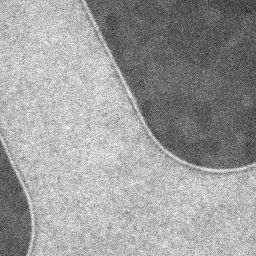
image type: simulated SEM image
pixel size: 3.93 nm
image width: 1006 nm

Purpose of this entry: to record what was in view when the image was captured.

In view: one or a few lines or trenches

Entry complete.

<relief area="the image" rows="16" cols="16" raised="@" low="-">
-----@@@@@@@@@@@
------@@@@@@@@@@
------@@@@@@@@@@
-------@@@@@@@@@
-------@@@@@@@@@
--------@@@@@@@@
--------@@@@@@@@
---------@@@@@@@
----------@@@@@@
----------@@@@@@
@------------@@-
@---------------
@@--------------
@@--------------
@@--------------
@@--------------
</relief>